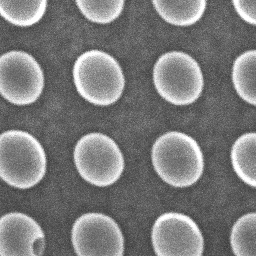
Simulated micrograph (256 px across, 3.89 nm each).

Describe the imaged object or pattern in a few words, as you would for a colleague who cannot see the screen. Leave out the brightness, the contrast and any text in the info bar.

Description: raised bodies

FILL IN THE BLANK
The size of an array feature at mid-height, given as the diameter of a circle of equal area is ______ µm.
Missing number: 0.197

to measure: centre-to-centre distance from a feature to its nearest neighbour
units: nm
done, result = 308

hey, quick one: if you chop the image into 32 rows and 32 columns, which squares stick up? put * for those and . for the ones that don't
******....*****....*******...***
*****.....*****.....*****.....**
.****......***.......****......*
................................
................................
................................
...........**..................*
****......****......****......**
*****....******....******....***
*****....******....******....***
*****.....*****....******....***
*****.....*****.....*****.....**
.***.......***.......***.......*
................................
................................
................................
.**.............................
****......****......****......**
*****....******....******....***
******...******....******....***
******...******....******....***
******....*****.....*****.....**
.****......***.......****.....**
................................
................................
................................
................................
****......****......****......**
*****....******....******....***
*****....******....******....***
****.....******....******....***
****......*****.....*****....***